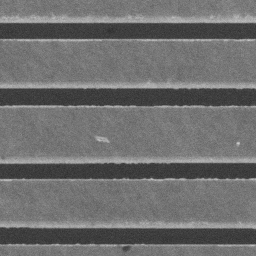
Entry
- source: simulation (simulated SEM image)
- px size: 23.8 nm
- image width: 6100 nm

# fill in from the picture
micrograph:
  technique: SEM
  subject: lines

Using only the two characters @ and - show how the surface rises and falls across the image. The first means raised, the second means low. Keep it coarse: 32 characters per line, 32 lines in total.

@@@@@@@@@@@@@@@@@@@@@@@@@@@@@@@@
@@@@@@@@@@@@@@@@@@@@@@@@@@@@@@@@
@@@@@@@@@@@@@@@@@@@@@@@@@@@@@@@@
--------------------------------
--------------------------------
@@@@@@@@@@@@@@@@@@@@@@@@@@@@@@@@
@@@@@@@@@@@@@@@@@@@@@@@@@@@@@@@@
@@@@@@@@@@@@@@@@@@@@@@@@@@@@@@@@
@@@@@@@@@@@@@@@@@@@@@@@@@@@@@@@@
@@@@@@@@@@@@@@@@@@@@@@@@@@@@@@@@
@@@@@@@@@@@@@@@@@@@@@@@@@@@@@@@@
--------------------------------
--------------------------------
@@@@@@@@@@@@@@@@@@@@@@@@@@@@@@@@
@@@@@@@@@@@@@@@@@@@@@@@@@@@@@@@@
@@@@@@@@@@@@@@@@@@@@@@@@@@@@@@@@
@@@@@@@@@@@@@@@@@@@@@@@@@@@@@@@@
@@@@@@@@@@@@@@@@@@@@@@@@@@@@@@@@
@@@@@@@@@@@@@@@@@@@@@@@@@@@@@@@@
@@@@@@@@@@@@@@@@@@@@@@@@@@@@@@@@
--------------------------------
--------------------------------
@@@@@@@@@@@@@@@@@@@@@@@@@@@@@@@@
@@@@@@@@@@@@@@@@@@@@@@@@@@@@@@@@
@@@@@@@@@@@@@@@@@@@@@@@@@@@@@@@@
@@@@@@@@@@@@@@@@@@@@@@@@@@@@@@@@
@@@@@@@@@@@@@@@@@@@@@@@@@@@@@@@@
@@@@@@@@@@@@@@@@@@@@@@@@@@@@@@@@
--------------------------------
--------------------------------
--------------------------------
@@@@@@@@@@@@@@@@@@@@@@@@@@@@@@@@